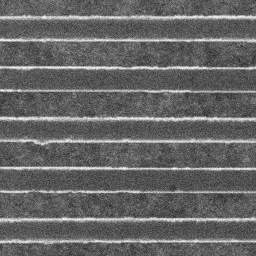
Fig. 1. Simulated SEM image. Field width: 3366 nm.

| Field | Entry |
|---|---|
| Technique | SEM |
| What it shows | lines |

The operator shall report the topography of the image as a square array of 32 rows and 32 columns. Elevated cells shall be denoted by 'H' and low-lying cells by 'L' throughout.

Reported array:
LLLLLLLLLLLLLLLLLLLLLLLLLLLLLLLL
LLLLLLLLLLLLLLLLLLLLLLLLLLLLLLLL
HHHHHHHHHHHHHHHHHHHHHHHHHHHHHHHH
HHHHHHHHHHHHHHHHHHHHHHHHHHHHHHHH
HHHHHHHHHHHHHHHHHHHHHHHHHHHHHHHH
LLLLLLLLLLLLLLLLLLLLLLLLLLLLLLLL
LLLLLLLLLLLLLLLLLLLLLLLLLLLLLLLL
LLLLLLLLLLLLLLLLLLLLLLLLLLLLLLLL
HHHHHHHHHHHHHHHLLHHLLHHHLLLLLLLL
HHHHHHHHHHHHHHHHHHHHHHHHHHHHHHHH
HHHHHHHHHHHHHHHHHHHHHHHHHHHHHHHH
LLLLLLLLLLLLLLLLLLLLLLLLLLLLLLLL
LLLLLLLLLLLLLLLLLLLLLLLLLLLLLLLL
LLLLLLLLLLLLLLLLLLLLLLLLLLLLLLLL
LLLLLLLLLLLLLLLLLLLLLLLLLLLLLLLL
HHHHHHHHHHHHHHHHHHHHHHHHHHHHHHHH
HHHHHHHHHHHHHHHHHHHHHHHHHHHHHHHH
HHHHHHHHHHHHHHHHHHHHHHHHHHHHHHHH
LLLLLLLLLLLLLLLLLLLLLLLLLLLLLLLL
LLLLLLLLLLLLLLLLLLLLLLLLLLLLLLLL
LLLLLLLLLLLLLLLLLLLLLLLLLLLLLLLL
HHHHHHHHHHHHHHHHHHHHHHHHHHHHHHHH
HHHHHHHHHHHHHHHHHHHHHHHHHHHHHHHH
HHHHHHHHHHHHHHHHHHHHHHHHHHHHHHHH
LLLLLLLLLLLLLLLLLLLLLLLLLLLLLLLL
LLLLLLLLLLLLLLLLLLLLLLLLLLLLLLLL
LLLLLLLLLLLLLLLLLLLLLLLLLLLLLLLL
LLLLLLLHHHHHLLLHHHHHHHHHHHHHHHHH
HHHHHHHHHHHHHHHHHHHHHHHHHHHHHHHH
HHHHHHHHHHHHHHHHHHHHHHHHHHHHHHHH
LLLLLLLLLLLLLLLLLLLLLLLLLLLLLLLL
LLLLLLLLLLLLLLLLLLLLLLLLLLLLLLLL